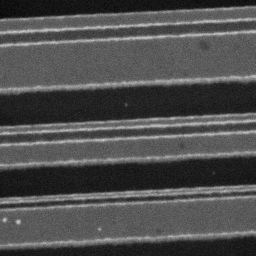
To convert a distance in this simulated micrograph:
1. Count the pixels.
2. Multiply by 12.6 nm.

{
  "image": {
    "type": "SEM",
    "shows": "lines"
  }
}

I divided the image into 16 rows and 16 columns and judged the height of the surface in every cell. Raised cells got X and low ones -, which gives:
--------------XX
XXXXXXXXXXXXXXXX
XXXXXXXXXXXXXXXX
XXXXXXXXXXXXXXXX
XXXXXXXXXXXXXXXX
XX--------------
----------------
---------XXXXXXX
XXXXXXXXXXXXXXXX
XXXXXXXXXXXXXXXX
----------------
----------------
XXXXXXXXXXXXXXXX
XXXXXXXXXXXXXXXX
XXXXXXXXXXXXXXXX
----------------